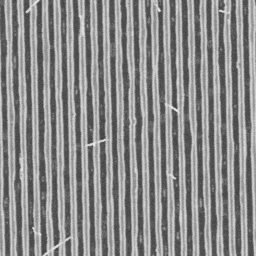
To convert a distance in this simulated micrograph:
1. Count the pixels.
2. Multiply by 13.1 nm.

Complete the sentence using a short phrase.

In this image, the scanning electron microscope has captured parallel lines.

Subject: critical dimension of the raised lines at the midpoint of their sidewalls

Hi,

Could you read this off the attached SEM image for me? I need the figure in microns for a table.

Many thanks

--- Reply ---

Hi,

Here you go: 0.0621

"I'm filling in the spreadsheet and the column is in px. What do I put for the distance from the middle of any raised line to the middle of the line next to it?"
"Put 12.2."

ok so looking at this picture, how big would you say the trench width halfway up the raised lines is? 99.6 nm